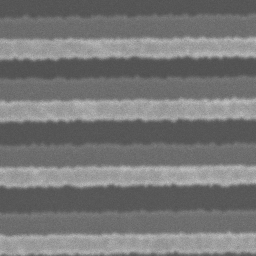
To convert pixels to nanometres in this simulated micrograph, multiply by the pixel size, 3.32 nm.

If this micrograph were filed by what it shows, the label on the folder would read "lines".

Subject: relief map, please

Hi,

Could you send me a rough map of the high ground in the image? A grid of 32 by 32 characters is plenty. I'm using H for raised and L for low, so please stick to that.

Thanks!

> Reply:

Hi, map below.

LLLLLLLLLLLLLLLLLLLLLLLLLLLLLLLL
LLLLLLLLLLLLLLLLLLLLLLLLLLLLLLLL
HHHHHHHHHHHHHHHHHHHHHHHHHHHHHHHH
HHHHHHHHHHHHHHHHHHHHHHHHHHHHHHHH
HHHHHHHHHHHHHHHHHHHHHHHHHHHHHHHH
HHHHHHHHHHHHHHHHHHHHHHHHHHHHHHHH
HHHHHHHHHHHHHHHHHHHHHHHHHHHHHHHH
LLLLLLLLLLLLLLLLLLLLLLLLLLLLLLLL
LLLLLLLLLLLLLLLLLLLLLLLLLLLLLLLL
LLLLLLLLLLLLLLLLLLLLLLLLLLLLLLLL
HHHHHHHHHHHHHHHHHHHHHHHHHHHHHHHH
HHHHHHHHHHHHHHHHHHHHHHHHHHHHHHHH
HHHHHHHHHHHHHHHHHHHHHHHHHHHHHHHH
HHHHHHHHHHHHHHHHHHHHHHHHHHHHHHHH
HHHHHHHHHHHHHHHHHHHHHHHHHHHHHHHH
LLLLLLLLLLLLLLLLLLLLLLLLLLLLLLLL
LLLLLLLLLLLLLLLLLLLLLLLLLLLLLLLL
LLLLLLLLLLLLLLLLLLLLLLLLLLLLLLLL
HHHHHHHHHHHHHHHHHHHHHHHHHHHHHHHH
HHHHHHHHHHHHHHHHHHHHHHHHHHHHHHHH
HHHHHHHHHHHHHHHHHHHHHHHHHHHHHHHH
HHHHHHHHHHHHHHHHHHHHHHHHHHHHHHHH
HHHHHHHHHHHHHHHHHHHHHHHHHHHHHHHH
LLLLLLLLLLLLLLLLLLLLLLLLLLLLLLLL
LLLLLLLLLLLLLLLLLLLLLLLLLLLLLLLL
LLLLLLLLLLLLLLLLLLLLLLLLLLLLLLLL
LLLLLLLLLLLLLLLLLHLLHLLHHHHLHHHH
HHHHHHHHHHHHHHHHHHHHHHHHHHHHHHHH
HHHHHHHHHHHHHHHHHHHHHHHHHHHHHHHH
HHHHHHHHHHHHHHHHHHHHHHHHHHHHHHHH
HHHHHHHHHHHHHHHHHHHHHHHHHHHHHHHH
HHHHHHHHHHHHHHHHHHHHHHHHHHHHHHHH